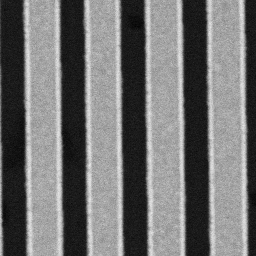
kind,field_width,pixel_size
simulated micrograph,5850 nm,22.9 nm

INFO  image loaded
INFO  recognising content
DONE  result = lines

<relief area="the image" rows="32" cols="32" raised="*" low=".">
...****....****...*****...****..
...****....****...*****...****..
...****....****...*****...*****.
...****....****...*****...*****.
...****....****...*****...*****.
...****....****...*****...*****.
...****....****...*****...*****.
...****....****...*****...*****.
...****....****...*****...*****.
...****....****...*****...*****.
...****....****...*****...*****.
...****....****...*****...*****.
...****....****...*****...*****.
...****....****...*****...*****.
...*****...****...*****...*****.
...****....****...*****...*****.
...*****...****...*****...*****.
...*****...****....****...*****.
...*****...****....****...*****.
...*****...****....****...*****.
...*****...****....****...*****.
...*****...****....****...*****.
...*****...****....****...*****.
...*****...****....****...*****.
...*****...****....****...*****.
...*****...****....****...*****.
...*****...****....****...*****.
...*****...****....****...*****.
...*****...****....****...*****.
...*****...****....****...*****.
...*****...****....****...*****.
...*****...****....****...*****.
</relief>